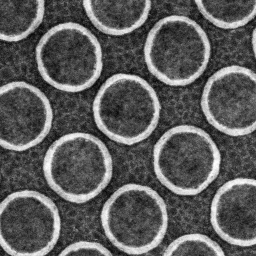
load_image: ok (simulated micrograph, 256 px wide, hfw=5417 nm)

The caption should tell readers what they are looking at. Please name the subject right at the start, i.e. raised bodies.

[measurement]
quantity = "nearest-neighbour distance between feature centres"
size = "1630 nm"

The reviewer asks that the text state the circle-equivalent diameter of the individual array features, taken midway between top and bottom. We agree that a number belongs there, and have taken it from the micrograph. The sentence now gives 1.32 µm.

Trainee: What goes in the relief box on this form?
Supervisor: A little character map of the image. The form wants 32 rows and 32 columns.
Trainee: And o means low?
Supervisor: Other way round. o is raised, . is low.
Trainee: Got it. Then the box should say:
ooooo......ooooooo.......ooooooo
ooooo......ooooooo........oooooo
ooooo.......oooooo...oo....oooo.
oooo...ooo...oooo..oooooo.......
ooo...ooooo........ooooooo......
.....ooooooo.......ooooooo......
.....ooooooo......oooooooo......
.....ooooooo.......ooooooo......
.....ooooooo.......oooooo.......
......oooooo........oooo...oooo.
..o....oooo..ooooo........oooooo
ooooo........oooooo.......oooooo
oooooo......oooooooo......oooooo
oooooo......oooooooo......oooooo
oooooo......oooooooo......oooooo
oooooo.......oooooo........ooooo
oooooo.......ooooo...oooo....o..
ooooo...oooo...oo...oooooo......
..o....oooooo.......ooooooo.....
......ooooooo.......ooooooo.....
......ooooooo.......ooooooo.....
......oooooooo......ooooooo.....
......ooooooo.......oooooo......
.......oooooo...oo....ooo...oooo
.oooo...ooo...oooooo.......ooooo
oooooo........oooooo.......ooooo
ooooooo......oooooooo......ooooo
ooooooo......oooooooo......ooooo
ooooooo......oooooooo......ooooo
ooooooo.......oooooo........oooo
ooooooo........oooo...oooo......
.ooooo..ooooo........oooooo.....